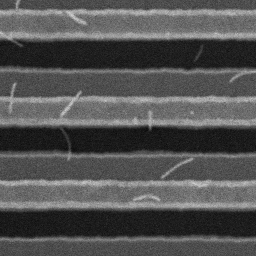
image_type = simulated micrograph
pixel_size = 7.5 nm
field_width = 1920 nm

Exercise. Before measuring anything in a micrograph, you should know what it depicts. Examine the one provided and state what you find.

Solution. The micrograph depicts lines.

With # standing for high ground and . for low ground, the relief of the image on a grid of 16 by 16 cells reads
################
################
................
................
################
################
################
################
................
................
################
################
################
................
................
################